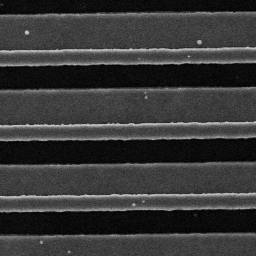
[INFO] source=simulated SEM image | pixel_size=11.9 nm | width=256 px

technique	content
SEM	lines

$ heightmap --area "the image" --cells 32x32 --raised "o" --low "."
................................
................................
oooooooooooooooooooooooooooooooo
oooooooooooooooooooooooooooooooo
oooooooooooooooooooooooooooooooo
oooooooooooooooooooooooooooooooo
oooooooooooooooooooooooooooooooo
oooooooooooooooooooooooooooooooo
................................
................................
................................
oooooooooooooooooooooooooooooooo
oooooooooooooooooooooooooooooooo
oooooooooooooooooooooooooooooooo
oooooooooooooooooooooooooooooooo
oooooooooooooooooooooooooooooooo
oooooooooooooooooooooooooooooooo
oooo.o..........................
................................
................................
.........................ooooooo
oooooooooooooooooooooooooooooooo
oooooooooooooooooooooooooooooooo
oooooooooooooooooooooooooooooooo
oooooooooooooooooooooooooooooooo
oooooooooooooooooooooooooooooooo
................................
................................
................................
.....ooooooooooooooooooooooooooo
oooooooooooooooooooooooooooooooo
oooooooooooooooooooooooooooooooo